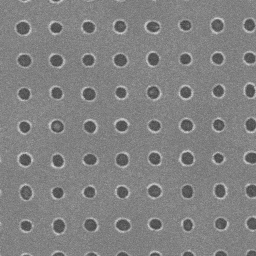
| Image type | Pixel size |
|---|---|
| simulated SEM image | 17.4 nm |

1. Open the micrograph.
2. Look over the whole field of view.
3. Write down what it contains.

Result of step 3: a regular array of holes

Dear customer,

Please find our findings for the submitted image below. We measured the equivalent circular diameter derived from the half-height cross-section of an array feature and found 0.22 microns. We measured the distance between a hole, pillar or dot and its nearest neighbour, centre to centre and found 557 nm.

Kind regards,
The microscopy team